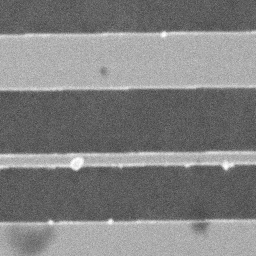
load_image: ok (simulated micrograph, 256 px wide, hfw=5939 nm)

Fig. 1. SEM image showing lines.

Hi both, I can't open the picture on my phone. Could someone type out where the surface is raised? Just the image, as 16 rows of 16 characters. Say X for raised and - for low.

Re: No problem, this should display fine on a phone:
----------------
----------------
XXXXXXXXXXXXXXXX
XXXXXXXXXXXXXXXX
XXXXXXXXXXXXXXXX
XXXXXXXX--------
----------------
----------------
----------------
----------------
----------------
----------------
----------------
----------------
XXXXXXXXXXXXXXXX
XXXXXXXXXXXXXXXX